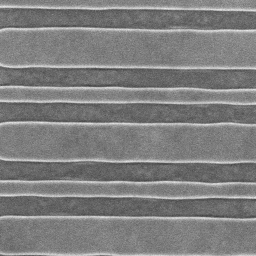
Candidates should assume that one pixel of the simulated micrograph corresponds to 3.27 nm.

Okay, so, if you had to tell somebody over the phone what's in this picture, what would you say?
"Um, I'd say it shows groups of lines, slits or small figures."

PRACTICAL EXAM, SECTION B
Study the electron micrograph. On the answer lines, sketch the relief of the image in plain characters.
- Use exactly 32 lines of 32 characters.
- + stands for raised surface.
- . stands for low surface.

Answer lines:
++++++++++++++++++++++++++++++++
................................
................................
.....+++++++....................
++++++++++++++++++++++++++++++++
++++++++++++++++++++++++++++++++
++++++++++++++++++++++++++++++++
++++++++++++++++++++++++++++++++
....................++++++++++++
................................
................................
++++++++++++++++++++++++++++++++
++++++++++++++++++++++++++++++++
................................
................................
+++++++++++++++++..+++++...+++..
++++++++++++++++++++++++++++++++
++++++++++++++++++++++++++++++++
++++++++++++++++++++++++++++++++
++++++++++++++++++++++++++++++++
................................
................................
................................
++++++++++++++++++++++++++++++++
++..++++++++++++++++++++++++++++
................................
................................
++++++++++++++++++++++++++++++++
++++++++++++++++++++++++++++++++
++++++++++++++++++++++++++++++++
++++++++++++++++++++++++++++++++
++++++++++++++++++++++++++++++++